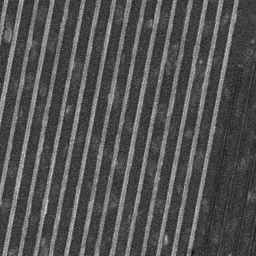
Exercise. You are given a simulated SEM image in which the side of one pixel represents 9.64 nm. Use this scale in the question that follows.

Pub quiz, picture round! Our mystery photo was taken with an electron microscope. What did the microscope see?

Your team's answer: parallel lines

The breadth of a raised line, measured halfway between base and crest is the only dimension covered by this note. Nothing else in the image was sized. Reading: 34.3 nanometres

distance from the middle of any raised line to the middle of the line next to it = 146 nm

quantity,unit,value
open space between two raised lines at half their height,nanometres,115